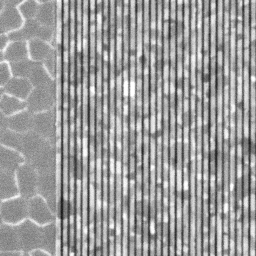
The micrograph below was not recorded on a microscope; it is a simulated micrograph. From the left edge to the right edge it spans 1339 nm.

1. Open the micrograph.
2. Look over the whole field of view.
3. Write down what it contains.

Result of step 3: parallel lines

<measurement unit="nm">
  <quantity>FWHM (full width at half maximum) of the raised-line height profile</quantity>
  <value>20.3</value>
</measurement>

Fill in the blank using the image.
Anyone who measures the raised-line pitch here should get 35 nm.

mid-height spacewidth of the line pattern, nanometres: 13.7